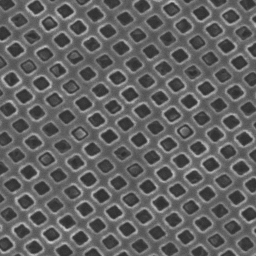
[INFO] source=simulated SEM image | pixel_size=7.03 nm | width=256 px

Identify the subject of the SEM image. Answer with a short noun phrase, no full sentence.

a regular array of holes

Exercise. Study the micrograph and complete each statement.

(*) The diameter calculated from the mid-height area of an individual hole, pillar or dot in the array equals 101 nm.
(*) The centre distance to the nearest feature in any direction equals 146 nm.